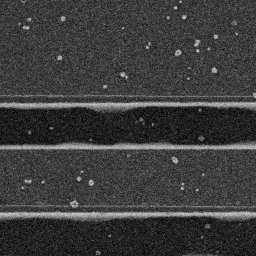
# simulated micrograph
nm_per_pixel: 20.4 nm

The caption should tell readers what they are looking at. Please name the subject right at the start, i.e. lines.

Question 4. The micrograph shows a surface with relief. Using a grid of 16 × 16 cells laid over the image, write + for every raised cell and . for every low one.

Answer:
++++++++++++++++
++++++++++++++++
++++++++++++++++
++++++++++++++++
++++++++++++++++
++++++++++++++++
+++++++++......+
................
................
++++++++++++++++
++++++++++++++++
++++++++++++++++
++++++++++++++++
................
................
................